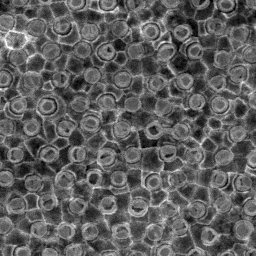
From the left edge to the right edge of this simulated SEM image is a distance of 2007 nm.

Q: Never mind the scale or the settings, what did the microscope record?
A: a regular array of raised bodies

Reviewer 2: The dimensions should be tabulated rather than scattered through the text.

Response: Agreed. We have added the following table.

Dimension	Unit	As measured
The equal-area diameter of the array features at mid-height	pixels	14.5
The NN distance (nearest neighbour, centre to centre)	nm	125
